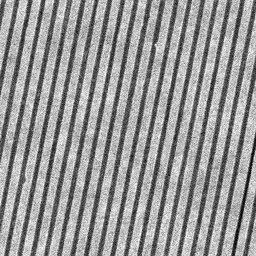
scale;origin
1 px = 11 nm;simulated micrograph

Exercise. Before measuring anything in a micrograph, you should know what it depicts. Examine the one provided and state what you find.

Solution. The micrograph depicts parallel lines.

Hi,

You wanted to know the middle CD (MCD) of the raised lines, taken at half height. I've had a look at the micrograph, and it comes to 81.1 nm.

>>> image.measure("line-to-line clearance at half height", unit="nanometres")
59.4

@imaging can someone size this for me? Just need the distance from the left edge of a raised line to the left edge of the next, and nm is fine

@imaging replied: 144